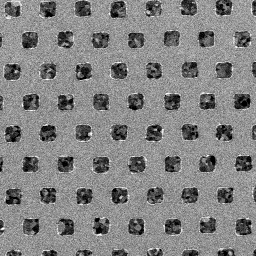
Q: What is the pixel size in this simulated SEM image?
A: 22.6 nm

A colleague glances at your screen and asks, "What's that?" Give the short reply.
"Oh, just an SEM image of a regular array of raised bodies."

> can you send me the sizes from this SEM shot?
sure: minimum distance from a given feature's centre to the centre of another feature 787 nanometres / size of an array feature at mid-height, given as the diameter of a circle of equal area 411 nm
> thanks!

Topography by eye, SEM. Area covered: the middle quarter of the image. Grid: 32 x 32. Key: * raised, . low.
...****.....****....****.....***
...****.....****....*****....***
...****.....****.....****....***
...****.....***......***........
................................
................................
................................
........**.......**.......**....
**.....****.....****.....****...
**.....****.....****.....****...
**.....****.....****.....****...
**........*......*..............
................................
................................
................................
...****.....****.....***.....***
...****.....****.....****....***
...****.....****.....****....***
...****.....****.....***......**
................................
................................
................................
................................
**......***......***.....****...
**.....****.....****.....****...
**.....****.....****.....****...
**.....****.....****.....****...
................................
................................
................................
................................
...****.....****.....****.....**